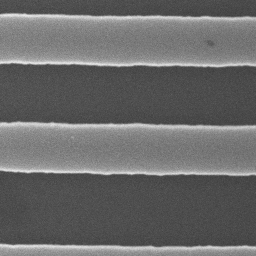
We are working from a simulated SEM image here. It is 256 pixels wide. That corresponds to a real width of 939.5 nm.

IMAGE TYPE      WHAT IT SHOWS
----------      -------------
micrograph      lines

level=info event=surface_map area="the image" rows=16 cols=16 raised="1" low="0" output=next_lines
0000000000000000
1111111111111111
1111111111111111
1111111111111111
0000000000000000
0000000000000000
0000000000000000
0000000000000000
1111111111111111
1111111111111111
1111111111111111
0000000000000000
0000000000000000
0000000000000000
0000000000000000
1111111111111111